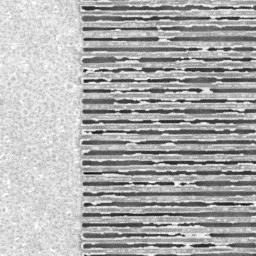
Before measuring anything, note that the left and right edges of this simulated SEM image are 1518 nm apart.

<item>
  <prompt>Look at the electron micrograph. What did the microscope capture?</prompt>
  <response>parallel lines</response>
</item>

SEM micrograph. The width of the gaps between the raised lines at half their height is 22.2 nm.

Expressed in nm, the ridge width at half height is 38.5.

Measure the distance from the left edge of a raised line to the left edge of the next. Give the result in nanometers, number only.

61.2